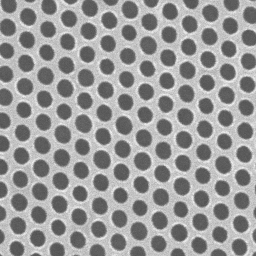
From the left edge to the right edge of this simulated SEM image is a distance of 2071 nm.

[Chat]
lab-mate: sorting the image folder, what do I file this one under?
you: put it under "a regular array of holes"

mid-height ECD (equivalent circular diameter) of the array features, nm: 139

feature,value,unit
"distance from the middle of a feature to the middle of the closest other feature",187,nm